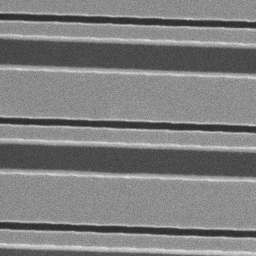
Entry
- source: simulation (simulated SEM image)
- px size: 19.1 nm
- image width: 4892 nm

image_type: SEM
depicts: lines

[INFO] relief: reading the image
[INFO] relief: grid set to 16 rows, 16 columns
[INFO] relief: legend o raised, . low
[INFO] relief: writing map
oooooooooooooooo
oooooooooooooooo
........oooooooo
................
ooooooo.........
oooooooooooooooo
oooooooooooooooo
oooooooooooooooo
oooooooooooooooo
................
................
oooooooooooooooo
oooooooooooooooo
oooooooooooooooo
oooooooooooooooo
......oooooooooo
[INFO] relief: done